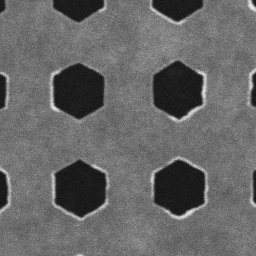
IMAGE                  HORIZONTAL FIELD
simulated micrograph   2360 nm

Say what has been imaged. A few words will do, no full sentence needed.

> holes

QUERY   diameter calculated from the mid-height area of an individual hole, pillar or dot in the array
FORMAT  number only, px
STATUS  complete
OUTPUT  53.3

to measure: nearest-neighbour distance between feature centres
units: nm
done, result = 903